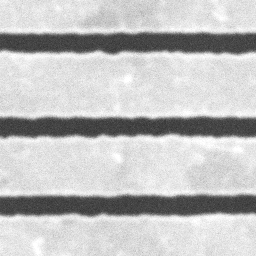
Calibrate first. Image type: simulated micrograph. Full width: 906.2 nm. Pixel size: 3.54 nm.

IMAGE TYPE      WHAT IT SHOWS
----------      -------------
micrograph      lines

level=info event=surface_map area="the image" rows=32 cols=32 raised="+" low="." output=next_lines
++++++++++++++++++++++++++++++++
++++++++++++++++++++++++++++++++
++++++++++++++++++++++++++++++++
++++++++++++++++++++++++++++++++
................................
................................
+...............................
++++++++++++++++++++++++++++++++
++++++++++++++++++++++++++++++++
++++++++++++++++++++++++++++++++
++++++++++++++++++++++++++++++++
++++++++++++++++++++++++++++++++
++++++++++++++++++++++++++++++++
++++++++++++++++++++++++++++++++
++++++.+++++++++++++++++...+.+++
................................
................................
++++++++++++++++++++++++++++++++
++++++++++++++++++++++++++++++++
++++++++++++++++++++++++++++++++
++++++++++++++++++++++++++++++++
++++++++++++++++++++++++++++++++
++++++++++++++++++++++++++++++++
++++++++++++++++++++++++++++++++
................................
................................
................................
++++++++++++++++++++++++++++++++
++++++++++++++++++++++++++++++++
++++++++++++++++++++++++++++++++
++++++++++++++++++++++++++++++++
++++++++++++++++++++++++++++++++